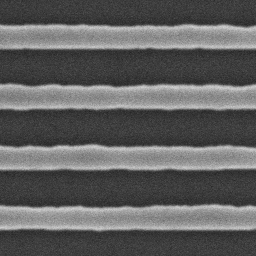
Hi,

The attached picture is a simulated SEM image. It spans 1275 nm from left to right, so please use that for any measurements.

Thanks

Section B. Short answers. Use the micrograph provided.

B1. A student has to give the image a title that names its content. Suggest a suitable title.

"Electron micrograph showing lines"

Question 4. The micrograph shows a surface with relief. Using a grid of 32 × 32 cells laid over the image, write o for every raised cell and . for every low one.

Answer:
................................
................................
................................
oooooooooooooooooooooooooooooooo
oooooooooooooooooooooooooooooooo
oooooooooooooooooooooooooooooooo
................................
................................
................................
................................
................................
oooooooooooooooooooooooooooooooo
oooooooooooooooooooooooooooooooo
oooooooooooooooooooooooooooooooo
................................
................................
................................
................................
oooooooooooooooooooooooo.oooooo.
oooooooooooooooooooooooooooooooo
oooooooooooooooooooooooooooooooo
................................
................................
................................
................................
................................
oooooooooooooooooooooooooooooooo
oooooooooooooooooooooooooooooooo
oooooooooooooooooooooooooooooooo
................................
................................
................................